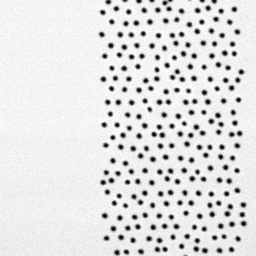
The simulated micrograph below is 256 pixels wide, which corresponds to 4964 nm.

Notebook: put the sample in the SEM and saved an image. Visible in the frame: a regular array of holes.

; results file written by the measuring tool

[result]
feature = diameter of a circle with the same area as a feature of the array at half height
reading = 109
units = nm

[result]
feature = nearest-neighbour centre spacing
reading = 203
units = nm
